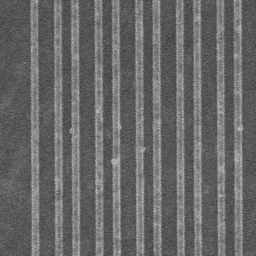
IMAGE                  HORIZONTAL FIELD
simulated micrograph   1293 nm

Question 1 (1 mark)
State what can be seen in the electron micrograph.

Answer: parallel lines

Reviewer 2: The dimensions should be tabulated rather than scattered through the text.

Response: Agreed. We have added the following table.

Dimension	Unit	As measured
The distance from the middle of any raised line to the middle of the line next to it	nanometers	103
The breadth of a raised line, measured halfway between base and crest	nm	29.7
